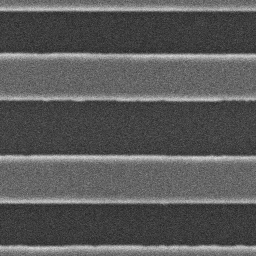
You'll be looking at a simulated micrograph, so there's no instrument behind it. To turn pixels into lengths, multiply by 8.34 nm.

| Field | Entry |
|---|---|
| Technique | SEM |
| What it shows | lines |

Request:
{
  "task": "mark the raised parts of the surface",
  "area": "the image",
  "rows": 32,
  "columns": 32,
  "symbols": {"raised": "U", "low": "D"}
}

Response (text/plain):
UUUUUUUUUUUUUUUUUUUUUUUUUUUUUUUU
DDDDDDDDDDDDDDDDDDDDDDDDDDDDDDDD
DDDDDDDDDDDDDDDDDDDDDDDDDDDDDDDD
DDDDDDDDDDDDDDDDDDDDDDDDDDDDDDDD
DDDDDDDDDDDDDDDDDDDDDDDDDDDDDDDD
DDDDDDDDDDDDDDDDDDDDDDDDDDDDDDDD
DDDDDDDDDDDDDDDDDDDDDDDDDDDDDDDD
UUUUUUUUUUUUUUUUUUUUUUUUUUUUUUUU
UUUUUUUUUUUUUUUUUUUUUUUUUUUUUUUU
UUUUUUUUUUUUUUUUUUUUUUUUUUUUUUUU
UUUUUUUUUUUUUUUUUUUUUUUUUUUUUUUU
UUUUUUUUUUUUUUUUUUUUUUUUUUUUUUUU
DDDDDUUDDUUDDDUUUUUUUUUUUUUUDDUD
DDDDDDDDDDDDDDDDDDDDDDDDDDDDDDDD
DDDDDDDDDDDDDDDDDDDDDDDDDDDDDDDD
DDDDDDDDDDDDDDDDDDDDDDDDDDDDDDDD
DDDDDDDDDDDDDDDDDDDDDDDDDDDDDDDD
DDDDDDDDDDDDDDDDDDDDDDDDDDDDDDDD
DDDDDDDDDDDDDDDDDDDDDDDDDDDDDDDD
DDDDDDDDDDDDDDDDDDDDDDDDDDDDDDDD
UUUUUUUUUUUUUUUUUUUUUUUUUUUUUUUU
UUUUUUUUUUUUUUUUUUUUUUUUUUUUUUUU
UUUUUUUUUUUUUUUUUUUUUUUUUUUUUUUU
UUUUUUUUUUUUUUUUUUUUUUUUUUUUUUUU
UUUUUUUUUUUUUUUUUUUUUUUUUUUUUUUU
DDDDDDDDDDDDDDDDDDDDDDDDDDDDDDDD
DDDDDDDDDDDDDDDDDDDDDDDDDDDDDDDD
DDDDDDDDDDDDDDDDDDDDDDDDDDDDDDDD
DDDDDDDDDDDDDDDDDDDDDDDDDDDDDDDD
DDDDDDDDDDDDDDDDDDDDDDDDDDDDDDDD
DDDDDDDDDDDDDDDDDDDDDDDDDDDDDDDD
UUUUUUUUUUUUUUUUUUUUUUUUUUUUUUUU